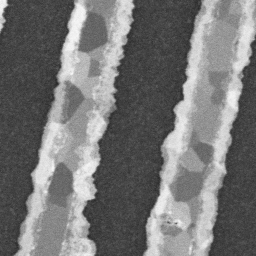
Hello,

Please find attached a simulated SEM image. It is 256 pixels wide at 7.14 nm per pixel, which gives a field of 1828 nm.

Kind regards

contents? one or a few lines or trenches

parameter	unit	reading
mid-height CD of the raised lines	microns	0.318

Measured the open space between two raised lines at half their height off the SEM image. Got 562 nanometres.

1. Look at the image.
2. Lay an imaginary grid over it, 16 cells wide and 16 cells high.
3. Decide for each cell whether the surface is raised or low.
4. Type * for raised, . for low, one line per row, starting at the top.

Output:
.....***.....***
.....***.....***
....***.....***.
....***.....***.
....***.....***.
....***.....***.
....***.....**..
...***.....***..
...***.....***..
...***.....***..
...***.....***..
...**.....***...
..***.....***...
..***.....***...
..***.....***...
.****.....***...